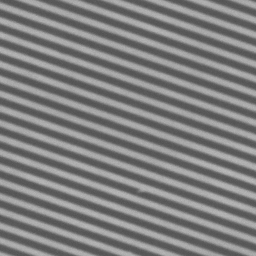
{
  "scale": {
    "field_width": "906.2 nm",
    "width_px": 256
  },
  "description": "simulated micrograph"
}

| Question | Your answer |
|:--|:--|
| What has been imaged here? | parallel lines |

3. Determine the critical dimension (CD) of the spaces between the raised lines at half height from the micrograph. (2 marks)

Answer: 26.7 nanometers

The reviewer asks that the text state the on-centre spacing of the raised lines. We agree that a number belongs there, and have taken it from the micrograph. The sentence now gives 49 nm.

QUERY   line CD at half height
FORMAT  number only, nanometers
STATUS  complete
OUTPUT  20.9